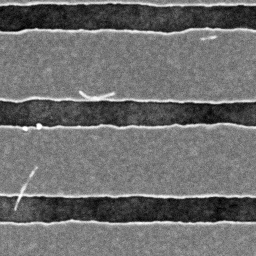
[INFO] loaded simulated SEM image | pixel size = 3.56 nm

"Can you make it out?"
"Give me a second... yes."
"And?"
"lines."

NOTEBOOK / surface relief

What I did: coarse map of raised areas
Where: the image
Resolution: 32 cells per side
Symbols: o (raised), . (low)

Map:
ooooo..oooo......ooooooooooooooo
................................
................................
................................
oooooooooooooooooooooooooooooooo
oooooooooooooooooooooooooooooooo
oooooooooooooooooooooooooooooooo
oooooooooooooooooooooooooooooooo
oooooooooooooooooooooooooooooooo
oooooooooooooooooooooooooooooooo
oooooooooooooooooooooooooooooooo
oooooooooooooooooooooooooooooooo
ooo....o.ooooooooooooooooooooooo
................................
................................
...........................oo...
oooooooooooooooooooooooooooooooo
oooooooooooooooooooooooooooooooo
oooooooooooooooooooooooooooooooo
oooooooooooooooooooooooooooooooo
oooooooooooooooooooooooooooooooo
oooooooooooooooooooooooooooooooo
oooooooooooooooooooooooooooooooo
oooooooooooooooooooooooooooooooo
.oooooooooooooooo.oooooooooooooo
................................
................................
................................
oooooooooooooooooooooooooooooooo
oooooooooooooooooooooooooooooooo
oooooooooooooooooooooooooooooooo
oooooooooooooooooooooooooooooooo